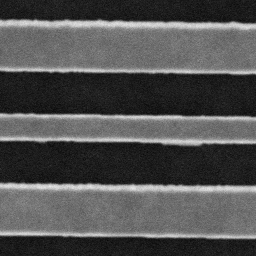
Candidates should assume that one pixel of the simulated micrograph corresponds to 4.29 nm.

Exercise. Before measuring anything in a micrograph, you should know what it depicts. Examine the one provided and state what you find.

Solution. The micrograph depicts lines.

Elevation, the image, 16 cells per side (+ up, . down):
................
+++++++++++++++.
++++++++++++++++
++++++++++++++++
..........++++++
................
................
++++++++++++++++
++++++++++++++++
................
................
................
++++++++++++++++
++++++++++++++++
++++++++++++++++
................